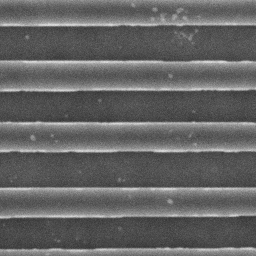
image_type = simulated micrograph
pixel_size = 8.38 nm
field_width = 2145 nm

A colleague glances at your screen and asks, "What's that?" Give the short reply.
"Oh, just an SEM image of lines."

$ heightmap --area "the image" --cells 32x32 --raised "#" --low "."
################################
################################
################################
................................
................................
................................
................................
................................
################################
################################
################################
................................
................................
................................
................................
################################
################################
################################
################################
................................
................................
................................
................................
................................
################################
################################
################################
................................
................................
................................
................................
################################